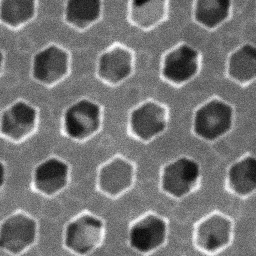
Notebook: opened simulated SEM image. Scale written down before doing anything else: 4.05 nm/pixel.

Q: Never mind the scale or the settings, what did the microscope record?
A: a regular array of raised bodies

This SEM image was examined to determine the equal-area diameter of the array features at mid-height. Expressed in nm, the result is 165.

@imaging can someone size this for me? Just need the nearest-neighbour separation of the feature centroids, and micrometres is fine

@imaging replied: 0.259